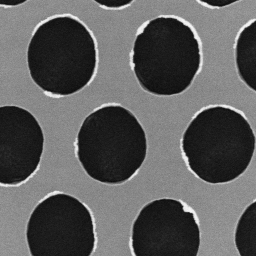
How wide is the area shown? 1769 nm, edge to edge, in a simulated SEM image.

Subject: holes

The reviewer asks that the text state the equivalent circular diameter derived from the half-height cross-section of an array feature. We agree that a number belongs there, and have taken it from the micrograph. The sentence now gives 504 nm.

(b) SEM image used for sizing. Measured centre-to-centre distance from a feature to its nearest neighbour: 708 nm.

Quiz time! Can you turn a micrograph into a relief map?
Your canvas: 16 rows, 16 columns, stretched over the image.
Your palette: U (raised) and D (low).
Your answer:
UUUUUUUUUUUUUUUU
UUUDDUUUUDDUUUUU
UUDDDDUUUDDDUUUD
UUDDDDUUDDDDUUUD
UUDDDDUUDDDDUUUD
UUUDDUUUUDDDUUUU
UUUUUUUUUUUUUUUU
DDUUUDDDDUUUDDDU
DDDUUDDDDUUUDDDD
DDDUUDDDDUUUDDDD
DDUUUDDDDUUUDDDU
DUUUUUUUUUUUUUUU
UUUDDUUUUUDUUUUU
UUDDDDUUUDDDUUUD
UUDDDDUUDDDDUUUD
UUDDDDUUDDDDUUUD